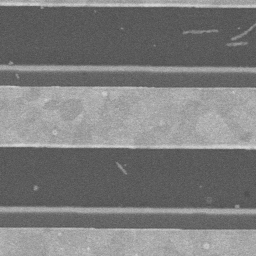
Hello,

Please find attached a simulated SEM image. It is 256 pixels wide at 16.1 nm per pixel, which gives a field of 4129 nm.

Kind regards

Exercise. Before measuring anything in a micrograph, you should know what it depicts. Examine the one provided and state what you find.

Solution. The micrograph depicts lines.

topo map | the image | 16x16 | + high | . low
................
................
................
................
................
++++++++++......
++++++++++++++++
++++++++++++++++
++++++++++++++++
................
................
................
................
................
++++++++++++++++
++++++++++++++++